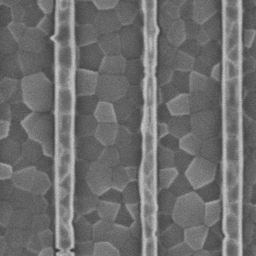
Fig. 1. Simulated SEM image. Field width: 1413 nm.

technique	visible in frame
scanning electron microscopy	one or a few lines or trenches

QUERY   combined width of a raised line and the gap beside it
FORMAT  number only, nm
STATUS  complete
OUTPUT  463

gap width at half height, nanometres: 380